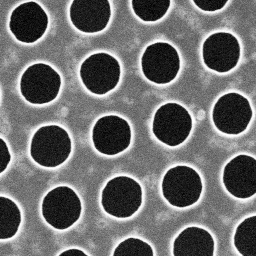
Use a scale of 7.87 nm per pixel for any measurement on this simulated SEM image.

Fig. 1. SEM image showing a regular array of holes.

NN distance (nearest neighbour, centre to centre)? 0.481 um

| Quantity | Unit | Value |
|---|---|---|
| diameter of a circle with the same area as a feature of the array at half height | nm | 325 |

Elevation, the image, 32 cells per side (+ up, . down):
+++..++++.....++.....+++....++++
++....+++.....+++....+++++++++++
+.....+++.....++++..++++++++++++
+.....++++...+++++++++++++++++++
++...+++++++++++++++++++++...+++
+++++++++++++++++++..++++.....++
++++++++++++++++++....+++.....++
+++++++++++....+++....+++.....++
+++....+++.....+++....++++...+++
+++....+++.....+++....++++++++++
++......++.....+++++++++++++++++
+++....++++...++++++++++++++++++
+++....++++++++++++++++++++....+
++++++++++++++++++++...++++....+
+++++++++++++..++++.....+++.....
++++++++++++....+++.....+++....+
++++....++++....+++.....++++..++
++++.....+++....++++...+++++++++
.+++.....+++....++++++++++++++++
.+++.....+++++++++++++++++++++.+
.++++...++++++++++++++++++++....
+++++++++++++++++++++....+++....
++++++++++++++...+++.....+++....
+++++++..++++.....++.....+++....
++++++....+++.....++.....++++..+
..+++.....+++.....+++...++++++++
...++.....+++....+++++++++++++++
...+++....+++++++++++++++++++++.
..+++++.+++++++++++++++..+++++..
..++++++++++++++++++++....+++...
+++++++++++++++...++++.....++...
++++++++..++++.....+++.....+++..